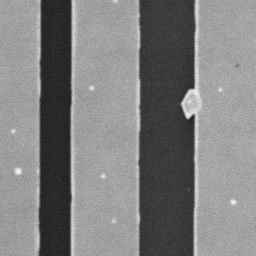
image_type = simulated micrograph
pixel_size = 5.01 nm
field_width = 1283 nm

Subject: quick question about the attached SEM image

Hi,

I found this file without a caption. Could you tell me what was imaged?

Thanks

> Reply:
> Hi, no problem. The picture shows lines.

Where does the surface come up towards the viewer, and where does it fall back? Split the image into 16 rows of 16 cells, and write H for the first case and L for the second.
HHLLLHHHHLLLHHHH
HHLLLHHHHLLLHHHH
HHLLLHHHHLLLHHHH
HHLLLHHHHLLLHHHH
HHLLLHHHHLLLHHHH
HHLLHHHHHLLLHHHH
HHLLHHHHHLLHHHHH
HHLLHHHHHLLLHHHH
HHLLHHHHHLLLHHHH
HHLLHHHHHLLLHHHH
HHLLHHHHHLLLHHHH
HHLLHHHHHLLLHHHH
HHLLHHHHHLLLHHHH
HHLLHHHHHLLLHHHH
HHLLHHHHHLLLHHHH
HHLLHHHHHLLLHHHH